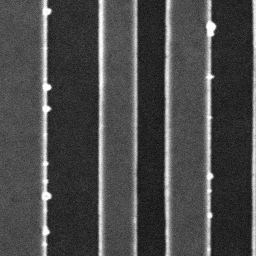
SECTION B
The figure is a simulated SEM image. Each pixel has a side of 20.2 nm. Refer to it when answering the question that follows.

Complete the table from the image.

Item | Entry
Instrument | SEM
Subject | lines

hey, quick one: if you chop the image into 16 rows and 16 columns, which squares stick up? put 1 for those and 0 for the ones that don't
1110001100111000
1110001100111000
1110001100111000
1110001100111000
1110001100111000
1110001100111000
1110001100111000
1110001100111000
1110001100111000
1110001100111000
1110001100111000
1110001100111000
1110001100111000
1110001100111000
1110001100111000
1110001100111000